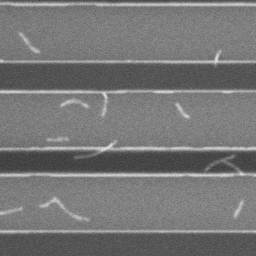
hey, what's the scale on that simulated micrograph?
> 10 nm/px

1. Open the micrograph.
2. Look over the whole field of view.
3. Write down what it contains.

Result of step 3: lines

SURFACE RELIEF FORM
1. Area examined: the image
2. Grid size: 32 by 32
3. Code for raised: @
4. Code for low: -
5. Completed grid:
-@@@@@@@@@@@@@@@@@@@@@@@@@@@@@@@
--------------------------------
--------------------------------
--------------------------------
--------------------------------
--------------------------------
--------------------------------
--------------------------------
@@@@@@@@@@@@@@@@@@@@@@@@@@@@@@@@
@@@@@@@@@@@@@@@@@@@@@@@@@@@@@@@@
@@@@@@@@@@@@@@@@@@@@@@@@@@@@@@@@
@@@@@@@@@@@@@@@@---@@------@@---
--------------------------------
--------------------------------
--------------------------------
--------------------------------
--------------------------------
--------------------------------
-------------@------------------
@@@@@@@@@@@@@@@@@@@@@@@@@@@@@@@@
@@@@@@@@@@@@@@@@@@@@@@@@@@@@@@@@
@@@@@@@@@@@@@@@@@@@@@@@@@@@@@@@@
--------------------------------
--------------------------------
--------------------------------
--------------------------------
--------------------------------
--------------------------------
--------------------------------
@@@@@@@@@@@@@@@@@@@@@@@@@@@@@@@@
@@@@@@@@@@@@@@@@@@@@@@@@@@@@@@@@
@@@@@@@@@@@@@@@@@@@@@@@@@@@@@@@@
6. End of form